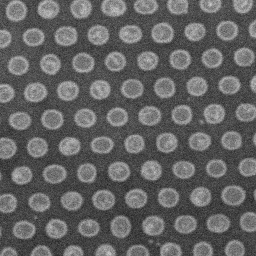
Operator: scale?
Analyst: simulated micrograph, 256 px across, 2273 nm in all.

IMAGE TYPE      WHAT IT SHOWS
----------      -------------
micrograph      a regular array of raised bodies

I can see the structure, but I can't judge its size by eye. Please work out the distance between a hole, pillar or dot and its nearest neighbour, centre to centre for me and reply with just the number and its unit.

280 nm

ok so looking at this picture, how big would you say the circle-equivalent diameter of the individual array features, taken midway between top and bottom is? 160 nanometres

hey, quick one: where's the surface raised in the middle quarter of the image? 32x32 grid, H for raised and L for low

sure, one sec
LLLHHHHLLLLHHHHLLLLHHHHLLLLHHHHL
LLLHHHLLLLLLHHLLLLLLLLLLLLLLLLLL
LLLLLLLLLLLLLLLLLLLLLLLLLLLLLLLL
LLLLLLLLLLLLLLLLLLLLLLLLLLLLLLLL
LLLLLLLLHHLLLLLLHHHLLLLLHHHLLLLH
HHHLLLLHHHHLLLLHHHHLLLLHHHHLLLLH
HHHLLLLHHHHLLLLHHHHHLLLHHHHLLLLH
HHHLLLLHHHHLLLLHHHHLLLLLHHHLLLLL
HHLLLLLLLHLLLLLLLLLLLLLLLLLLLLLL
LLLLLLLLLLLLLLLLLLLLLLLLLLLLLLLL
LLLLLLLLLLLLLLLLLLLLLLLLLLLLLLLL
LLLLLLLLLLLLHHHLLLLLHHHLLLLLHHHL
LLLHHHHLLLLHHHHLLLLHHHHHLLLHHHHH
LLLHHHHHLLLHHHHLLLLHHHHHLLLHHHHH
LLLHHHHLLLLHHHHLLLLHHHHLLLLLHHHL
LLLLLHLLLLLLLLLLLLLLLLLLLLLLLLLL
LLLLLLLLLLLLLLLLLLLLLLLLLLLLLLLL
LLLLLLLLLLLLLLLLLLLLLLLLLLLLLLLL
LLLLLLLLLLLLLLLLHHHLLLLLHHHHLLLL
HHHLLLLHHHHHLLLHHHHHLLLHHHHHLLLH
HHHHLLLHHHHHLLLHHHHHLLLHHHHHLLLL
HHHHLLLLHHHLLLLLHHHLLLLLHHHLLLLL
LHLLLLLLLLLLLLLLLLLLLLLLLLLLLLLL
LLLLLLLLLLLLLLLLLLLLLLLLLLLLLLLL
LLLLLLLLLLLLLLLLLLLLLLLLLLLLLLLL
LLLLLHHLLLLLHHHHLLLLHHHHLLLLHHHH
LLLLHHHHLLLHHHHHLLLLHHHHLLLLHHHH
LLLLHHHHLLLHHHHHLLLLHHHHLLLLHHHH
LLLLHHHHLLLLHHHLLLLLLHHLLLLLLLLL
LLLLLLLLLLLLLLLLLLLLLLLLLLLLLLLL
LLLLLLLLLLLLLLLLLLLLLLLLLLLLLLLL
LLLLLLLLLLLLLLLLLLLLLLLLLHHLLLLL